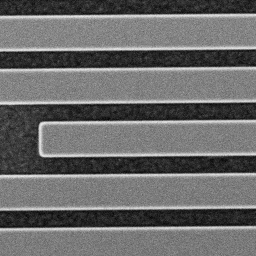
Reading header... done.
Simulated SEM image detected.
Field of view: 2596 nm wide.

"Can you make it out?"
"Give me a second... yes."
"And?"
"groups of lines, slits or small figures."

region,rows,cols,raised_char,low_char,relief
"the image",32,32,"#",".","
................................
................................
################################
################################
################################
################################
................................
................................
..............................##
################################
################################
################################
################################
................................
................................
.....###########################
.....###########################
.....###########################
.....###########################
.....####.......................
................................
................................
################################
################################
################################
################################
................................
................................
.................###############
################################
################################
################################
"